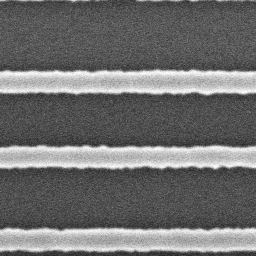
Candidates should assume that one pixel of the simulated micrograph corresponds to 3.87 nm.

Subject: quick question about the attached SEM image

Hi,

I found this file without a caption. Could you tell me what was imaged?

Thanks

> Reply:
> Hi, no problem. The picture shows lines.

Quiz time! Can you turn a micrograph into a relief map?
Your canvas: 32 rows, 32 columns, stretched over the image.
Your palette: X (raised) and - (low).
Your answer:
--------------------------------
--------------------------------
--------------------------------
--------------------------------
--------------------------------
--------------------------------
--------------------------------
--------------------------------
--------------------------------
XXXXXXXXXXXXXXXXXXXXXXXXXXXXXXXX
XXXXXXXXXXXXXXXXXXXXXXXXXXXXXXXX
XXXXXXXXXXXXXXXXXXXXXXXX-XXXXXXX
--------------------------------
--------------------------------
--------------------------------
--------------------------------
--------------------------------
--------------------------------
-XXXXXXXXXXXXX-XX-XXX---XXXXX--X
XXXXXXXXXXXXXXXXXXXXXXXXXXXXXXXX
XXXXXXXXXXXXXXXXXXXXXXXXXXXXXXXX
--------------------------------
--------------------------------
--------------------------------
--------------------------------
--------------------------------
--------------------------------
--------------------------------
--------------------------------
XXXXXXXXXXXXXXXXXXXXXXXXXXXXXXXX
XXXXXXXXXXXXXXXXXXXXXXXXXXXXXXXX
--------------------------------